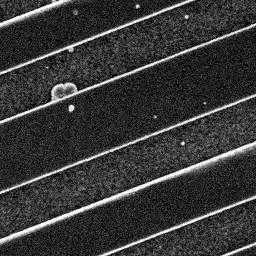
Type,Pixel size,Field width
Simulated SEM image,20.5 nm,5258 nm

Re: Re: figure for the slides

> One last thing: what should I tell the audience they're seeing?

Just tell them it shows lines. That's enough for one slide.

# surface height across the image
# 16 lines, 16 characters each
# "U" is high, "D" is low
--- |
DDDUUUUUUUUDDDDD
UUUUUUUUDDDDDDDD
UUUUUUDDDDDDDUUU
UUUDDDDDDDDUUUUU
DDDDDDDDUUUUUUUU
DDDDDUUUUUUUUUUU
DDDUUUUUUUUUUUUD
UUUUUUUUUUUUDDDD
UUUUUUUUUDDDDDDD
UUUUUUUDDDDDDDUU
UUUUDDDDDDDDUUUU
UUDDDDDDDUUUUUUU
DDDDDDDUUUUUUUUU
DDDDUUUUUUUUUDDD
DUUUUUUUUUDDDDDD
UUUUUUUUDDDDDDDU